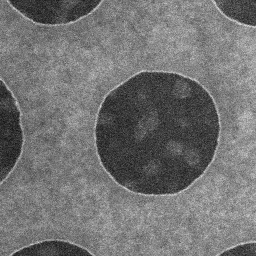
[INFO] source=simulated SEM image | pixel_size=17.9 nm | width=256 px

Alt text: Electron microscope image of holes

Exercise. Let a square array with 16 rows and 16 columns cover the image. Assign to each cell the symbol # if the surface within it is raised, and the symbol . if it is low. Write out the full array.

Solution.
#.....########..
###.###########.
################
################
#########.######
#######......###
.#####.......###
.#####........##
.#####........##
.#####.......###
.######......###
#######.....####
################
################
################
##...#########..